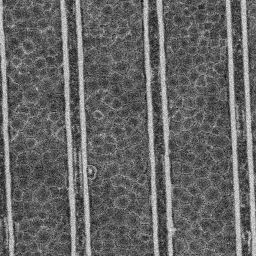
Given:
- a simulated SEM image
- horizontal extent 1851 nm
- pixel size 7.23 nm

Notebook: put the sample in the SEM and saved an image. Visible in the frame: one or a few lines or trenches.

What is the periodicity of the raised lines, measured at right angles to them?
0.597 micrometres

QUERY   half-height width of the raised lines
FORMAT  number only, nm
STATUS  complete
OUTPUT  110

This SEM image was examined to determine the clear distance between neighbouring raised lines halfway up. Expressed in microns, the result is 0.483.